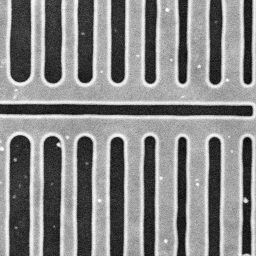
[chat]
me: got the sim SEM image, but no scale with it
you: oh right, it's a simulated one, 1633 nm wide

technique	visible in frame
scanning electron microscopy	groups of lines, slits or small figures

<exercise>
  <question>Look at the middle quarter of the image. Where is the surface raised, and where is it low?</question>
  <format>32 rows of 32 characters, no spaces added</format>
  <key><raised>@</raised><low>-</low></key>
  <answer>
@@@----@@@@-----@@@@---@@@@@---@
@@@----@@@@-----@@@@---@@@@@---@
@@@----@@@@-----@@@@---@@@@@---@
@@@----@@@@@---@@@@@---@@@@@---@
@@@@---@@@@@---@@@@@---@@@@@@--@
@@@@@@@@@@@@@@@@@@@@@@@@@@@@@@@@
@@@@@@@@@@@@@@@@@@@@@@@@@@@@@@@@
@@@@@@@@@@@@@@@@@@@@@@@@@@@@@@@@
@@@@@@@@@@@@@@@@@@@@@@@@@@@@@@@@
@@@@@@@@@@@@@@@@@@@@@@@@@@@@@@@@
--------------------------------
--------------------------------
--------------------------------
@@@@@@@@@@@@@@@@@@@@@@@@@@@@@@@@
@@@@@@@@@@@@@@@@@@@@@@@@@@@@@@@@
@@@@@@@@@@@@@@@@@@@@@@@@@@@@@@@@
@@@@@@@@@@@@@@@@@@@@@@@@@@@@@@@@
@@@@@@@@@@@@@@@@@@@@@@@@@@@@@@@@
@@@@---@@@@@---@@@@@---@@@@@@--@
@@@----@@@@----@@@@@---@@@@@---@
@@@----@@@@----@@@@@---@@@@@---@
@@@----@@@@----@@@@@---@@@@@---@
@@@----@@@@----@@@@@---@@@@@---@
@@@----@@@@----@@@@@---@@@@@---@
@@@----@@@@-----@@@@---@@@@@---@
@@@----@@@@-----@@@@---@@@@@---@
@@@----@@@@-----@@@@---@@@@@---@
@@@----@@@@-----@@@@---@@@@@---@
@@@----@@@@----@@@@@---@@@@@---@
@@@----@@@@----@@@@@---@@@@@---@
@@@----@@@@----@@@@@---@@@@@---@
@@@----@@@@----@@@@@---@@@@@---@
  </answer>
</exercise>